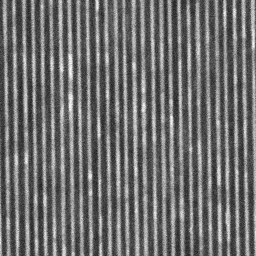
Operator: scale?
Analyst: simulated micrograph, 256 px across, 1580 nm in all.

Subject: parallel lines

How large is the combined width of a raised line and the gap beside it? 9.17 pixels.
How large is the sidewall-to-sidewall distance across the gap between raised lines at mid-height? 40.9 nm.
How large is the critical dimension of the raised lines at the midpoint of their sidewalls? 15.4 nm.